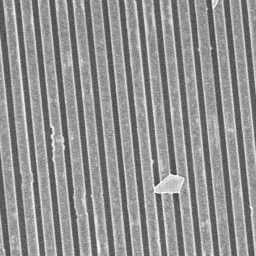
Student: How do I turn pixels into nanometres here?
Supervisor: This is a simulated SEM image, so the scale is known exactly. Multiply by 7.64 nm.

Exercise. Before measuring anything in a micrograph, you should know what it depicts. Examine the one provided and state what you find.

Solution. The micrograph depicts parallel lines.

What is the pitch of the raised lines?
132 nm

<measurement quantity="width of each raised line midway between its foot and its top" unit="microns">0.0818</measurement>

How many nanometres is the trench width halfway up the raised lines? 52.3